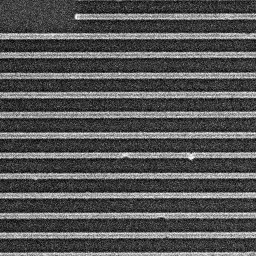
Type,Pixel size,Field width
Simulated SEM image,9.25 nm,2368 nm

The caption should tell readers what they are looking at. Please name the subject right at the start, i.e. parallel lines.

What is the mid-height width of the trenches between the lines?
0.14 microns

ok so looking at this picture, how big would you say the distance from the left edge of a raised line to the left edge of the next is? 184 nm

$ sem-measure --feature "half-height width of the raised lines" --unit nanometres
49.7